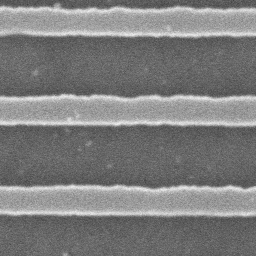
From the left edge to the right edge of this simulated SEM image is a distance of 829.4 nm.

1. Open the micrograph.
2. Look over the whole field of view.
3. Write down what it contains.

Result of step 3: lines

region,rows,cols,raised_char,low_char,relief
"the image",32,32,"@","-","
--------------------------------
@@@@@@@@@@@@@@@@@@@@@@@@@@@@@@@@
@@@@@@@@@@@@@@@@@@@@@@@@@@@@@@@@
@@@@@@@@@@@@@@@@@@@@@@@@@@@@@@@@
--------------------------------
--------------------------------
--------------------------------
--------------------------------
--------------------------------
--------------------------------
--------------------------------
--------------------------------
@@@@@@@@@@@@@@@@@@@@@@@@@@@@@@@@
@@@@@@@@@@@@@@@@@@@@@@@@@@@@@@@@
@@@@@@@@@@@@@@@@@@@@@@@@@@@@@@@@
@@--@@@@@@@@@@@@@-@@-@@@@@@@@@@@
--------------------------------
--------------------------------
--------------------------------
--------------------------------
--------------------------------
--------------------------------
--------------------------------
@@@-@@@@@@@@@@@@@@---@@@@@@-@@-@
@@@@@@@@@@@@@@@@@@@@@@@@@@@@@@@@
@@@@@@@@@@@@@@@@@@@@@@@@@@@@@@@@
@@@@@@@@@@@@@@@@@@@@@@@@@@@@@@@@
--------------------------------
--------------------------------
--------------------------------
--------------------------------
--------------------------------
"